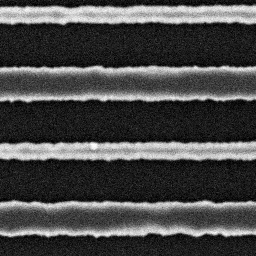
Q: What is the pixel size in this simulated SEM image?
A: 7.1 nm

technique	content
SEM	lines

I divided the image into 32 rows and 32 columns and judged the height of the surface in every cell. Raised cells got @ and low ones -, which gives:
--------------------------------
@@@@@@@@@@@@@@@@@@@@@@@@@@@@@@@@
@@@@@@@@@@@@@@@@@@@@@@@@@@@@@@@@
--------------------------------
--------------------------------
--------------------------------
--------------------------------
--------------------------------
-@@@----@@-@@---@-@@---@@-@@@@-@
@@@@@@@@@@@@@@@@@@@@@@@@@@@@@@@@
@@@@@@@@@@@@@@@@@@@@@@@@@@@@@@@@
@@@@@@@@@@@@@@@@@@@@@@@@@@@@@@@@
@@@@@@@@-@@-----@-@@-@@@-@-@@---
--------------------------------
--------------------------------
--------------------------------
--------------------------------
--------------------------------
@@@@@@@@@@@@@@@@@@@@@@@@@@@@@@@@
@@@@@@@@@@@@@@@@@@@@@@@@@@@@@@@@
--------------------------------
--------------------------------
--------------------------------
--------------------------------
--------------------------------
@@@@@@-@@@@@@@@@@@@@@@@@@@@@@@@@
@@@@@@@@@@@@@@@@@@@@@@@@@@@@@@@@
@@@@@@@@@@@@@@@@@@@@@@@@@@@@@@@@
@@@@@@@@@@@@@@@@@@@@@@@@@@@@@@@@
-@------------------------------
--------------------------------
--------------------------------